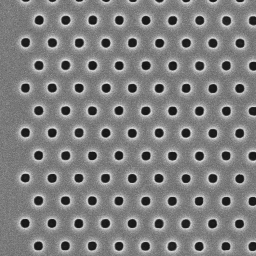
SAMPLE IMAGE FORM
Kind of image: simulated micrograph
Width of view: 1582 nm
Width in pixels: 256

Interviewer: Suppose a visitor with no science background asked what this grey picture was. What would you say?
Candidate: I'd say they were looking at a regular array of holes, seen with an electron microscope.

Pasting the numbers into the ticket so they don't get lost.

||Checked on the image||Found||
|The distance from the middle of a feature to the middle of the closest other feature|159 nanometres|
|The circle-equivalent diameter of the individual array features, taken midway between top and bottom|9.16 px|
